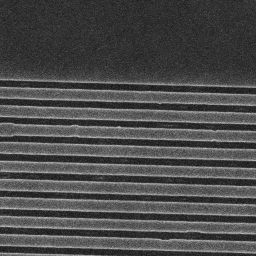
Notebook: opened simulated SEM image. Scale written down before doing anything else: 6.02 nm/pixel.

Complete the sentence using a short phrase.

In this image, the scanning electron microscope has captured parallel lines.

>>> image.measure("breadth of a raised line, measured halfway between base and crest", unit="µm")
0.0707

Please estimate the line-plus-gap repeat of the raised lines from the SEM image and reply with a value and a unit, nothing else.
18.4 pixels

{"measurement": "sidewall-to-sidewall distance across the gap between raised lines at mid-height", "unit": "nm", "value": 43.6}